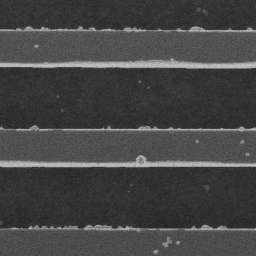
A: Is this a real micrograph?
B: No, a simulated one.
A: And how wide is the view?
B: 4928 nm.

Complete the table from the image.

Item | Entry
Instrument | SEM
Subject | lines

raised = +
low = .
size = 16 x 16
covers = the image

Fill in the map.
................
................
++++++++++++++++
++++++++++++++++
................
................
................
................
++++++++++++++++
++++++++++++++++
................
................
................
................
++++++++++++++++
++++++++++++++++